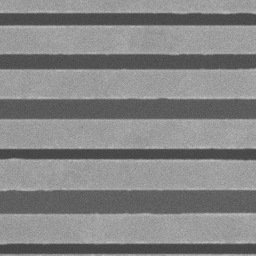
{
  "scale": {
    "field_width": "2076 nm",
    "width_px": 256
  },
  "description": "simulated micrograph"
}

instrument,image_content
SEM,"lines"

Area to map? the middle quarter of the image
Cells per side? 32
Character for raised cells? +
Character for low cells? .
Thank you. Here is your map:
................................
...............+................
++++++++++++++++++++++++++++++++
++++++++++++++++++++++++++++++++
++++++++++++++++++++++++++++++++
++++++++++++++++++++++++++++++++
++++++++++++++++++++++++++++++++
++++++++++++++++++++++++++++++++
++++++++++++++++++++++++.+++++++
................................
................................
................................
................................
................................
++++++++++++++++++++++++++++++++
++++++++++++++++++++++++++++++++
++++++++++++++++++++++++++++++++
++++++++++++++++++++++++++++++++
++++++++++++++++++++++++++++++++
++++++++++++++++++++++++++++++++
++++++++++++++++++++++++++++++++
................................
................................
................................
++++++++++++++++++++++++++++++++
++++++++++++++++++++++++++++++++
++++++++++++++++++++++++++++++++
++++++++++++++++++++++++++++++++
++++++++++++++++++++++++++++++++
++++++++++++++++++++++++++++++++
++++++++++++++++++++++++++++++++
................+......++.......